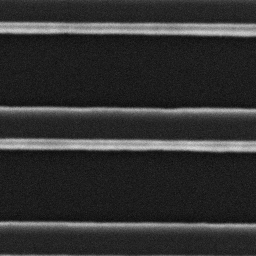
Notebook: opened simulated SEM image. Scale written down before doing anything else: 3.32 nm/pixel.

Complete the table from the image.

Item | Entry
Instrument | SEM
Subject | lines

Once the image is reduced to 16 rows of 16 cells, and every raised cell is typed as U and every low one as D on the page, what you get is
UUUUUUUUUUUUUUUU
UUUUUUUUUUUUUUUU
DDDDDDDDDDDDDDDD
DDDDDDDDDDDDDDDD
DDDDDDDDDDDDDDDD
DDDDDDDDDDDDDDDD
DDDDDDDDDDDDDDDD
UUUUUUUUUUUUUUUU
UUUUUUUUUUUUUUUU
DDDDDDDDDDDDDDDD
DDDDDDDDDDDDDDDD
DDDDDDDDDDDDDDDD
DDDDDDDDDDDDDDDD
DDDDDDDDDDDDDDDD
UUUUUUUUUUUUUUUU
UUUUUUUUUUUUUUUU